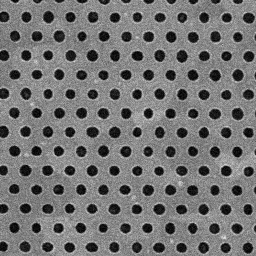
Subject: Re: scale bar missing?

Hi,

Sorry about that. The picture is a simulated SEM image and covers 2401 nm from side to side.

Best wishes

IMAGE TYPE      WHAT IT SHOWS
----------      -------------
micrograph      a regular array of holes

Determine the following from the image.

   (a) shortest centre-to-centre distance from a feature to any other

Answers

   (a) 205 nanometers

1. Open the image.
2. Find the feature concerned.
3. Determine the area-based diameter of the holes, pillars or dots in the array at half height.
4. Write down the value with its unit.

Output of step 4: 106 nanometers